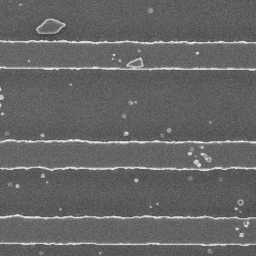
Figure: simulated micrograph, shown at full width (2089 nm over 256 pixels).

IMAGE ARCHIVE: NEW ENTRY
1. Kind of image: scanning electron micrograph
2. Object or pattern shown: lines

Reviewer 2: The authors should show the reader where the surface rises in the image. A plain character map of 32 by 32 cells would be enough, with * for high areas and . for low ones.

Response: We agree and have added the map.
................................
................................
................................
................................
................................
********************************
********************************
********************************
********************************
................................
................................
................................
................................
................................
................................
................................
................................
................................
********************************
********************************
********************************
................................
................................
................................
................................
................................
................................
********************************
********************************
********************************
..********..********************
................................